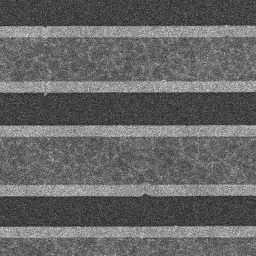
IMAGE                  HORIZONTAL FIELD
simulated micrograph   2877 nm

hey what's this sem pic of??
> one or a few lines or trenches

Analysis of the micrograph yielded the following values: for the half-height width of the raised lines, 56.5 px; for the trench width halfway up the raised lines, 495 nm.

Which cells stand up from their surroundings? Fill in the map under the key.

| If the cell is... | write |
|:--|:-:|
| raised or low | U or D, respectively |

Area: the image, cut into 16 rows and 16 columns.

DDDDDDDDDDDDDDDD
DDDDDDDDDDDDDDDD
UUUUUUUUUUUUUUUU
UUUUUUUUUUUUUUUU
UUUUUUUUUUUUUUUU
DDDDDDDDDDDDDDDD
DDDDDDDDDDDDDDDD
DDDDDDDDDDDDDDDD
UUUUUUUUUUUUUUUU
UUUUUUUUUUUUUUUU
UUUUUUUUUUUUUUUU
UUUUUUUUUUUUUUUU
DDDDDDDDDDDDDDDD
DDDDDDDDDDDDDDDD
DDDDDDDDDDDDDDDD
UUUUUUUUUUUUUUUU